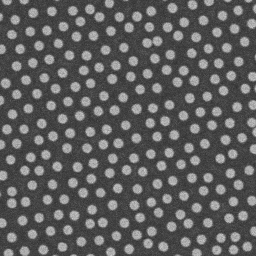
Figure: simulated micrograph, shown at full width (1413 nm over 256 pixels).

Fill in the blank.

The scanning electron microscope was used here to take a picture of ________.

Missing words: a regular array of raised bodies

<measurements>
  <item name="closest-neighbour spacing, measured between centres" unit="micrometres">0.087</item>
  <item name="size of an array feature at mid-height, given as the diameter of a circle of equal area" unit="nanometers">50.9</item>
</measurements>